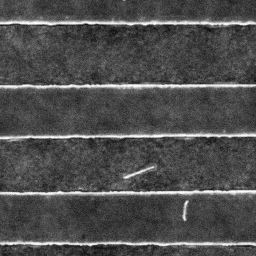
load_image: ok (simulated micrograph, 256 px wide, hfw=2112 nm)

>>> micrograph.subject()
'lines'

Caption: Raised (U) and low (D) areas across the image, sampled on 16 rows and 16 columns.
UUUUUUUUUUUUUUUU
DDDDDDDDUUDDDUUU
DDDDDDDDDDDDDDDD
DDDDDDDDDDDDDDDD
DDDDDDDDDDDDDDDD
UUUUUUUUUUUUUUUU
UUUUUUUUUUUUUUUU
UUUUUUUUUUUUUUUU
UUUUUUUUUUDDDDDD
DDDDDDDDDDDDDDDD
DDDDDDDDDDDDDDDD
DDDDDDDDDDDDDDDD
UUUUUUUUUUUUUUUU
UUUUUUUUUUUUUUUU
UUUUUUUUUUUUUUUU
DDDDDDDDDDDDDDDD